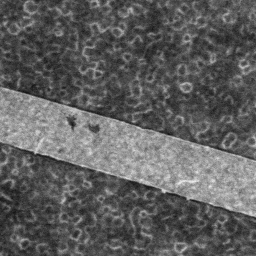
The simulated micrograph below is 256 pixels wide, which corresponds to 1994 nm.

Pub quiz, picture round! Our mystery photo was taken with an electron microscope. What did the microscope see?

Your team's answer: one or a few lines or trenches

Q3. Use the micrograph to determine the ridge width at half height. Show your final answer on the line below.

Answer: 49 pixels